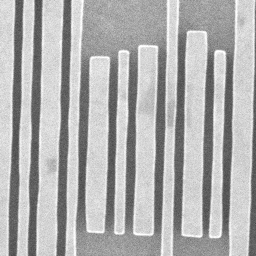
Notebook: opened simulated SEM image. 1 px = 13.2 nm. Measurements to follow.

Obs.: groups of lines, slits or small figures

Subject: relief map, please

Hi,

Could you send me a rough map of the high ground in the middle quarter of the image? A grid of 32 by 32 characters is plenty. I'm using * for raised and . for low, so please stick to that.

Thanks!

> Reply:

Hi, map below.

..**...****...**...****...**..**
..**...****...**...****...**..**
..**...****...**...****...**..**
..**...****...**...****...**..**
..**...****...**...****...**..**
..**...****...**...****...**..**
..**...****...**...****...**..**
..**...****...**...****...**..**
..**...****...**..*****...**..**
..**..*****...**..*****...**..**
..**..*****...**..*****...**..**
.***..*****...**..*****...**..**
.***..*****..***..*****...**..**
.***..*****..***..*****...**..**
.***..*****..***..*****...**..**
.**...*****..***..*****...**..**
.**...*****..***..*****..**...**
.**...*****..***..*****..**...**
.**...*****..***..*****..**...**
.**...*****..**...*****..**...**
.**...*****..**...*****..**...**
.**...*****..**...*****..**...**
.**...*****..**...*****..**...**
.**...*****..**...*****..**...**
.**...*****..**...*****..**...**
.**...*****..**...****...**...**
.**...*****..**...****...**...**
.**...*****..**...****...**...**
.**...*****..**...****...**...**
.**...*****..**...****...**...**
.**...*****..**...****...**...**
.**..******..**...****...**...**